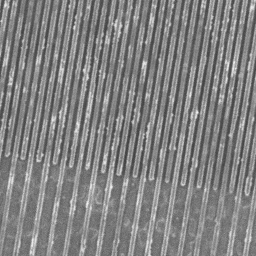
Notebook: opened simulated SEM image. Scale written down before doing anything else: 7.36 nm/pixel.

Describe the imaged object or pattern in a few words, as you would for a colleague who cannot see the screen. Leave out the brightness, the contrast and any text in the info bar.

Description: parallel lines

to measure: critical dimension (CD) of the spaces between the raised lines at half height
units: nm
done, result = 26.4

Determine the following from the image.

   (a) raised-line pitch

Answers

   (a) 8.11 pixels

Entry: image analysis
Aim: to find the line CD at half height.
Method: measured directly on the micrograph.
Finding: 33.6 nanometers